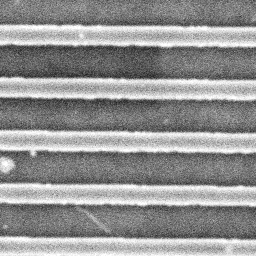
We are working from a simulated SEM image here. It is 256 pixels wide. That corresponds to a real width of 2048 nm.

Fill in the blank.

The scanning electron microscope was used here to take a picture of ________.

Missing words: lines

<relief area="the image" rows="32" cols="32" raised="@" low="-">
--------------------------------
--------------------------------
--------------------------------
@@@@@@@@@@@@@@@@@@@@@@@@@@------
@@@@@@@@@@@@@@@@@@@@@@@@@@@@@@@@
---------@@@--@@-@@@@@@@@@@@@@@@
--------------------------------
--------------------------------
--------------------------------
--------------------------------
@@@@@@@@@@@@@@@@@@@@@@@@@@@@@@@@
@@@@@@@@@@@@@@@@@@@@@@@@@@@@@@@@
--------------------------------
--------------------------------
--------------------------------
--------------------------------
@@@@@@-@------------------------
@@@@@@@@@@@@@@@@@@@@@@@@@@@@@@@@
@@@@@@@@@@@@@@@@@@@@@@@@@@@@@@@@
--------------------------------
--------------------------------
--------------------------------
--------------------------------
@@@@@@@@@@@@@@@@@@@@@@@@@@@@@@@@
@@@@@@@@@@@@@@@@@@@@@@@@@@@@@@@@
----------------@@@--@@@@@@@@@@@
--------------------------------
--------------------------------
--------------------------------
--------------------------------
@@@@@@@@@@@@@@@@@@@@@@@@@@@@@@@@
@@@@@@@@@@@@@@@@@@@@@@@@@@@@@@@@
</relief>